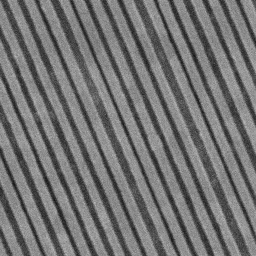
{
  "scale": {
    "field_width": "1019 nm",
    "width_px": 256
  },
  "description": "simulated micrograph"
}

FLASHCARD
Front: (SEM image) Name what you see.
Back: parallel lines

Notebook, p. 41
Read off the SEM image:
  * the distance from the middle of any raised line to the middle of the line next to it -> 0.0615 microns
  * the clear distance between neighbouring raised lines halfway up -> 26.6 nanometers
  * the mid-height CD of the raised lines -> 36.7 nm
